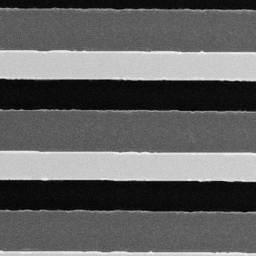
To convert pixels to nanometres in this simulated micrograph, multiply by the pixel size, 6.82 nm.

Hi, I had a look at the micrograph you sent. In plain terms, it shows lines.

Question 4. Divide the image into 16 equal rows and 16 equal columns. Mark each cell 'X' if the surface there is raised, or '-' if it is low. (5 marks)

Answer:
----------------
XXXXXXXXXXXXXXXX
XXXXXXXXXXXXXXXX
XXXXXXXXXXXXXXXX
XXXXXXXXXXXXXXXX
----------------
----------------
XXXXXXXXXXXXXXXX
XXXXXXXXXXXXXXXX
XXXXXXXXXXXXXXXX
XXXXXXXXXXXXXXXX
----------------
----------------
XXXXXXXXXXXXXXXX
XXXXXXXXXXXXXXXX
XXXXXXXXXXXXXXXX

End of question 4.